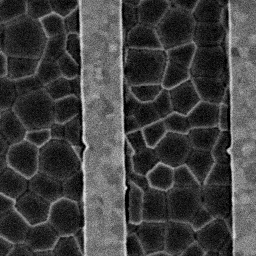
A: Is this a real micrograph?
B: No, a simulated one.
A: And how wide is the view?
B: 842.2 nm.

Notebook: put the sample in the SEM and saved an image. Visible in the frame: one or a few lines or trenches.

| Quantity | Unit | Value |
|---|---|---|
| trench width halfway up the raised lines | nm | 354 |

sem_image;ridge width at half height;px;41.1